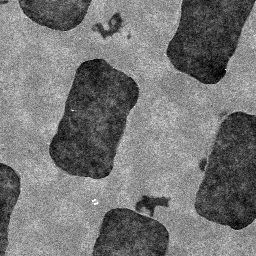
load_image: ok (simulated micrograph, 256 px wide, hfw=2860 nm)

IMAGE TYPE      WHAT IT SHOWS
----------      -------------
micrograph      holes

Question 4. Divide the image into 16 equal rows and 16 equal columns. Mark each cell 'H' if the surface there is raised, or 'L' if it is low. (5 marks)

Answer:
HLLLLLHHHHHLLLLL
HHLLLHHHHHHLLLLH
HHHHHHHHHHHLLLLH
HHHHHHHHHHLLLLHH
HHHHHLLLHHHLLLHH
HHHHLLLLLHHHHHHH
HHHHLLLLHHHHHHHH
HHHHLLLLHHHHHHLL
HHHLLLLLHHHHHLLL
HHHLLLLHHHHHHLLL
LHHHLLLHHHHHHLLL
LHHHHHHHHHHHHLLL
LHHHHHHHHHHHLLLL
LHHHHHHLLHHHHLLL
LHHHHHLLLLHHHHHH
HHHHHHLLLLLHHHHH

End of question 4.